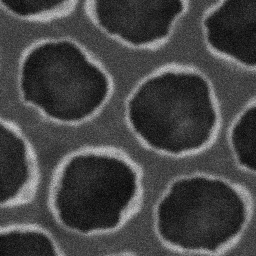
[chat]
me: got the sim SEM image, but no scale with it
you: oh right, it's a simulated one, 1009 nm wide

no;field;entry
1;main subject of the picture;holes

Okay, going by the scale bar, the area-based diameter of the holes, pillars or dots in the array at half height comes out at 0.326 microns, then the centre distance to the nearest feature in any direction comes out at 427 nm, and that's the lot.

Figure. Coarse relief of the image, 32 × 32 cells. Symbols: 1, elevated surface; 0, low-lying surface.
00000000111000000000000111110000
11000001111000000000000111000000
11111111111100000000001111000000
11111111111110000000011111000000
11111111111111100000011111000000
11111000011111111001111111000000
11110000001111111111111111100000
11100000000111111111111111111100
11100000000011111111111111111111
11100000000001111110000001111111
11100000000001111100000000111111
11100000000001111000000000111111
11100000000001110000000000111111
11111000000011110000000000011110
11111100000111110000000000011100
01111111111111111000000000011100
00111111111111111000000000011000
00011111111111111100000000111000
00011111111111111110000001111000
00001111100000111111111111111100
00001111000000001111111111111100
00001110000000000111111111111111
00001110000000000111111000111111
00011110000000000111100000000111
00111110000000000111100000000011
11111110000000001111000000000001
11111110000000001111000000000001
11111110000000011111000000000001
11011111100000111111000000000011
00000011111111111111000000000011
00000001111111111111100000000111
00000001111111111111111111111111